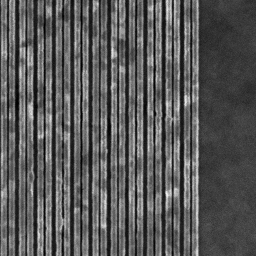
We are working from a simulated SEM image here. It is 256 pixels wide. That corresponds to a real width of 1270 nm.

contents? parallel lines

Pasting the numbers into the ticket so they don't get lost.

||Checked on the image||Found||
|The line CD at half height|27.3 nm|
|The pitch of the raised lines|45.2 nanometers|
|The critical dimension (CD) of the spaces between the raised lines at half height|0.023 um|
